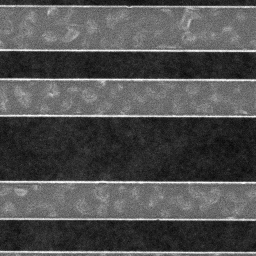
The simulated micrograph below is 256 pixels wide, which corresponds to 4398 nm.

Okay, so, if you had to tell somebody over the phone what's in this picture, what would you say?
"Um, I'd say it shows one or a few lines or trenches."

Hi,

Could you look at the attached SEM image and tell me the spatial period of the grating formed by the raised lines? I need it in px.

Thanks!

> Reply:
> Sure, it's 85.4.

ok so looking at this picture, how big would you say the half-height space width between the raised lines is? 640 nm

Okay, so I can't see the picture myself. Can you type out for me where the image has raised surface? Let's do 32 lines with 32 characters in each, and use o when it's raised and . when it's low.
oooooooooooooooooooooooooooooooo
................................
................................
................................
................................
................................
oooooooooooooooooooooooooooooooo
oooooooooooooooooooooooooooooooo
oooooooooooooooooooooooooooooooo
oooooooooooooooooooooooooooooooo
................................
................................
................................
................................
oooooooooooo....................
oooooooooooooooooooooooooooooooo
oooooooooooooooooooooooooooooooo
oooooooooooooooooooooooooooooooo
oooooooooooooooooooooooooooooooo
oooooooooooooooooooooooooooooooo
oooooooooooooooooooooooooooooooo
oooooooooooooooooooooooooooooooo
oooooooooooooooooooooooooooooooo
................................
................................
................................
................................
oooooooooooooooooooooooooooooo..
oooooooooooooooooooooooooooooooo
oooooooooooooooooooooooooooooooo
oooooooooooooooooooooooooooooooo
........oooooooooooooooooooooooo